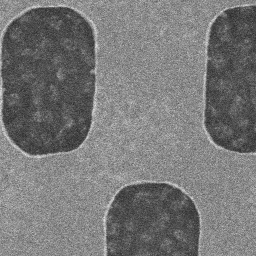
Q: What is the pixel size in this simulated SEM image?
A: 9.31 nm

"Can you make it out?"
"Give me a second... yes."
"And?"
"holes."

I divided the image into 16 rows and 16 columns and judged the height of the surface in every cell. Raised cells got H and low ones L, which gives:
HHHLHHHHHHHHHHLL
HLLLLLHHHHHHHLLL
LLLLLLHHHHHHHLLL
LLLLLLHHHHHHHLLL
LLLLLLHHHHHHHLLL
LLLLLLHHHHHHHLLL
LLLLLLHHHHHHHLLL
LLLLLLHHHHHHHLLL
LLLLLHHHHHHHHLLL
HHLLHHHHHHHHHHHL
HHHHHHHHHHHHHHHH
HHHHHHHHLLHHHHHH
HHHHHHHLLLLLHHHH
HHHHHHHLLLLLHHHH
HHHHHHHLLLLLHHHH
HHHHHHHLLLLLHHHH